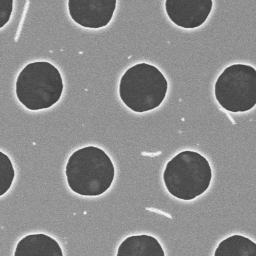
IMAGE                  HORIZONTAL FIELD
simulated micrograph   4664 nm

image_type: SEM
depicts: holes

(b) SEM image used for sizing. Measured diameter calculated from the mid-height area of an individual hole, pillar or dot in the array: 48 pixels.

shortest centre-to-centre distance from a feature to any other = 97.9 px